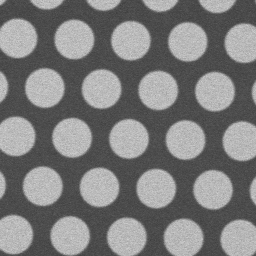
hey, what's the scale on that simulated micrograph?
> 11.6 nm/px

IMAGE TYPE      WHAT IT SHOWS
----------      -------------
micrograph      an array of small figures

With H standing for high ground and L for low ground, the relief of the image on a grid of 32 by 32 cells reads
LLLLHHHHLLLHHHHLLLHHHHLLLHHHHLLL
LLLLLLLLLLLLLLLLLLLLLLLLLLHHLLLL
LHHLLLLLLHLLLLLLLLLLLLLLLLLLLLLL
HHHHLLLHHHHLLLLHHHLLLLHHHLLLLHHH
HHHHHLLHHHHHLLHHHHHLLHHHHHLLHHHH
HHHHHLLHHHHHLLHHHHHLLHHHHHLLHHHH
HHHHLLLHHHHLLLHHHHLLLHHHHLLLHHHH
LLLLLLLLLLLLLLLLHLLLLLLHLLLLLHHH
LLLLLLLLLLLLLLLLLLLLLLLLLLLLLLLL
HLLLHHHLLLLHHHLLLLHHHLLLLHHHLLLL
HLLHHHHHLLHHHHHLLHHHHHLLLHHHHLLL
HLLHHHHHLLHHHHHLLHHHHHLLHHHHHLLL
LLLLHHHHLLLHHHHLLLHHHHLLLHHHHLLL
LLLLLLLLLLLLHLLLLLLHHLLLLLHHLLLL
LLLLLLLLLLLLLLLLLLLLLLLLLLLLLLLL
HHHHLLLHHHHLLLLHHHLLLLHHHLLLLHHL
HHHHLLLHHHHLLLHHHHLLLHHHHLLLHHHH
HHHHLLLHHHHLLLHHHHLLLHHHHHLLHHHH
HHHHLLLHHHHLLLHHHHLLLHHHHLLLHHHH
LLLLLLLLHHLLLLLHHLLLLLHHHLLLLHHH
LLLLLLLLLLLLLLLLLLLLLLLLLLLLLLLL
LLLLHHHLLLLHHHLLLLHHHLLLLLHLLLLL
HLLHHHHHLLHHHHHLLHHHHHLLLHHHHLLL
HLLHHHHHLLHHHHHLLHHHHHLLHHHHHLLH
LLLHHHHLLLHHHHHLLHHHHHLLHHHHHLLH
LLLLHHLLLLLHHHLLLLHHHLLLLHHHLLLL
LLLLLLLLLLLLLLLLLLLLLLLLLLLLLLLL
HHHLLLLHHHLLLLLHHLLLLLHHLLLLLLLL
HHHHLLLHHHHLLLHHHHLLLHHHHLLLHHHH
HHHHLLHHHHHLLHHHHHLLLHHHHLLLHHHH
HHHHLLLHHHHLLLHHHHLLLHHHHLLLHHHH
LHHLLLLHHHLLLLHHHLLLLHHHHLLLHHHH